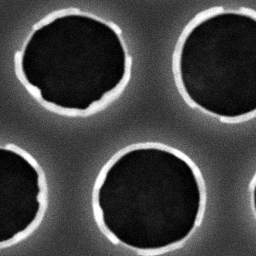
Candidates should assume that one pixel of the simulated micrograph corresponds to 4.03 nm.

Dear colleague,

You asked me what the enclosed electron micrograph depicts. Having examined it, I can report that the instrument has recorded holes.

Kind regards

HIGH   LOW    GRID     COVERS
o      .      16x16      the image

oooooooooooooooo
ooo....ooooo....
oo.....ooooo....
o.......ooo.....
o.......ooo.....
oo.....ooooo....
ooo...oooooo....
oooooooooooooooo
oooooooooooooooo
.ooooooo..oooooo
..ooooo.....oooo
..oooo......oooo
..oooo......oooo
..oooo......oooo
.oooooo.....oooo
oooooooo..oooooo